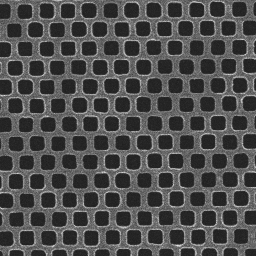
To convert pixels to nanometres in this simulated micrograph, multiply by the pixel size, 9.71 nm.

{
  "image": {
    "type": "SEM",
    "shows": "a regular array of holes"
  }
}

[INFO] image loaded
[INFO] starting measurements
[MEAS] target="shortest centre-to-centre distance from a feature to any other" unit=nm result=206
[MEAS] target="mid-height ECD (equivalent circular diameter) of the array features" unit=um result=0.154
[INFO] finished